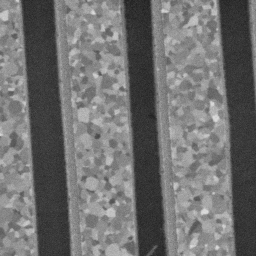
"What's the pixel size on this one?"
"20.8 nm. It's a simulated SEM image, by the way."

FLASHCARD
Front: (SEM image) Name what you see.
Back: lines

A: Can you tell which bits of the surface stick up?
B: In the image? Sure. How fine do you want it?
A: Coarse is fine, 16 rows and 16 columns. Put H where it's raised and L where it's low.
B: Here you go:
HLLLHHHHLLHHHHLL
HLLLHHHHLLHHHHLL
HLLLHHHHLLHHHHLL
HLLLHHHHLLHHHHLL
HLLLHHHHLLHHHHLL
HHLLHHHHLLHHHHLL
HHLLHHHHLLHHHHLL
HHLLHHHHLLHHHHLL
HHLLHHHHLLHHHHLL
HHLLHHHHLLHHHHLL
HHLLHHHHLLHHHHLL
HHLLHHHHLLHHHHLL
HHLLHHHHLLHHHHLL
HHLLHHHHLLHHHHLL
HHLLHHHHLLHHHHLL
HHLLLHHHHLLHHHHL